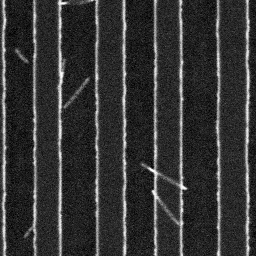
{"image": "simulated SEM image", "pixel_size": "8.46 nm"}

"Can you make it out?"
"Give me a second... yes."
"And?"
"lines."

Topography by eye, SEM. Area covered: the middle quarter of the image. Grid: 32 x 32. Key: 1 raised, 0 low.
00000000111111100000000111111000
00000000111111100000000111111000
00000000111111100000000111111000
00000000111111100000000111111000
00000000111111100000000111111000
00000000111111100000000111111000
00000000111111100000000111111000
00000000111111100000000111111000
00000000111111100000000111111100
00000000111111100000000111111000
00000000111111100000000111111000
00000000111111100000000111111000
00000000111111100000000111111000
00000000111111100000000111111000
00000000111111100000000111111000
00000000111111100000000111111000
00000000111111100000000111111000
00000000111111100000000111111000
00000000111111100000000111111000
00000000111111100000000111111000
00000000111111100000000111111000
00000000111111100000000111111000
00000000111111100000000111111000
00000000111111100000000111111000
00000000111111100000000111111000
00000000111111100000000111111000
00000000111111100000001111111000
00000000111111100000000111111000
00000000111111100000000111111000
00000000111111100000000111111000
00000000111111100000000111111100
00000000111111100000000111111100